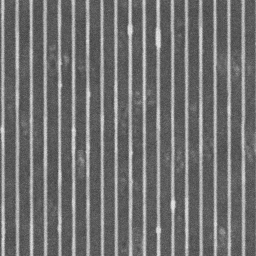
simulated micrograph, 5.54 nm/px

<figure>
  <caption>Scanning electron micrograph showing parallel lines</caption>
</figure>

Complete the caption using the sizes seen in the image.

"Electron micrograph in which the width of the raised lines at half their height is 15.9 nm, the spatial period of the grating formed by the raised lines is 0.0784 micrometres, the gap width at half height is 64.3 nanometres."